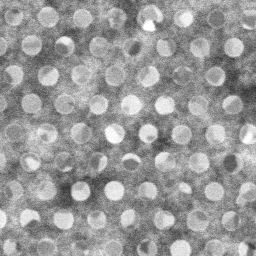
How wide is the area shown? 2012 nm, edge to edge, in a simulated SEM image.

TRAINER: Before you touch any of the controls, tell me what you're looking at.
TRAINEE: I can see a regular array of raised bodies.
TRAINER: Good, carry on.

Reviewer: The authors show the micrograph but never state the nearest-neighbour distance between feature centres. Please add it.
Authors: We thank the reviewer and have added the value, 0.258 um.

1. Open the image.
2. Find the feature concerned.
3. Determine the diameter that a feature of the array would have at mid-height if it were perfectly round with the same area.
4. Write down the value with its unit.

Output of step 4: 146 nm